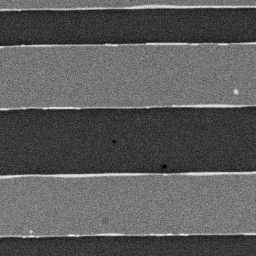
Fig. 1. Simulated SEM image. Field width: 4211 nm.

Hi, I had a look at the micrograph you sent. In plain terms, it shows groups of lines, slits or small figures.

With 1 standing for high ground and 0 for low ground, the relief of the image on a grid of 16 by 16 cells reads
1111110000000000
0000000000000000
0000000000000000
1111111111111111
1111111111111111
1111111111111111
1111111111111111
0000000000000000
0000000000000000
0000000000000000
0000000000000000
1111111111111111
1111111111111111
1111111111111111
1111111111111111
0000000000000000